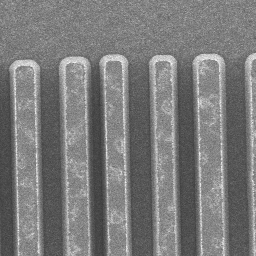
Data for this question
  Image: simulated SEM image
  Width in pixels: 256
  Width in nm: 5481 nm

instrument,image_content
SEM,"parallel lines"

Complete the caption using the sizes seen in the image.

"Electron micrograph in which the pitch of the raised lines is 0.984 micrometres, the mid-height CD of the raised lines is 527 nanometres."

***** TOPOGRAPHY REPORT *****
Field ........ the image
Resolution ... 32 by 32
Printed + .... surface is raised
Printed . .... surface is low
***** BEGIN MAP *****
................................
................................
................................
................................
................................
................................
................................
.............++....++....++....+
..+++...+++..+++...+++..++++...+
..+++...+++..+++...+++..++++...+
..+++...+++..+++...+++...+++...+
..+++...+++..+++...+++...+++...+
..+++...+++..+++...+++...+++...+
..+++...+++..+++...+++...+++...+
..+++...+++..+++...+++...+++...+
..+++...+++..+++...+++...+++...+
..+++...+++..+++...+++...+++...+
..+++...+++..+++...+++...+++...+
..+++...+++..+++...+++...+++...+
..+++...+++..+++...+++...+++...+
..+++...+++..+++...+++...+++...+
..+++...+++..+++...+++...+++...+
..+++...+++..+++...+++...+++...+
..+++...+++..+++...+++...+++...+
..+++...+++..+++...+++...+++...+
..+++...+++..+++...+++...+++...+
..+++...+++..+++...+++...+++...+
..+++...+++..+++...+++...+++...+
..+++...+++..+++...+++...+++...+
..+++...+++..+++...+++...+++...+
..+++...+++..+++....++...+++...+
..+++...+++..+++....++...+++...+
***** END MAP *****